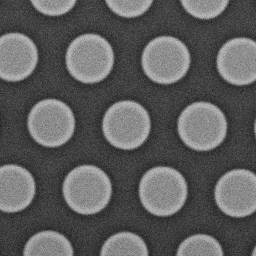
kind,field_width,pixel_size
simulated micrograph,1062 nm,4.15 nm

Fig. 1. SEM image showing an array of small figures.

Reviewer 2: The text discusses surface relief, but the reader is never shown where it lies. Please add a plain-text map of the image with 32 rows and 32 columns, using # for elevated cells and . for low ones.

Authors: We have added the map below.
....#####....######....#####....
.....###......####......####....
................................
................................
###.......##....................
####.....#####.....####.....####
#####...######....######...#####
#####...######....######...#####
####....######....#####....#####
###......####.....#####.....####
.............................##.
................................
................................
....#####.....####.....####.....
....#####....######....#####....
....#####....######...######....
....#####....######...######....
....####.....#####.....#####....
...............##.......###.....
................................
................................
###......####.....####.......##.
####....######....#####....#####
####....######...######....#####
####....######....#####....#####
####.....####.....#####....#####
..........##.......###......####
................................
................................
....####......###.......##......
...######....#####.....####.....
...######....#####....######....